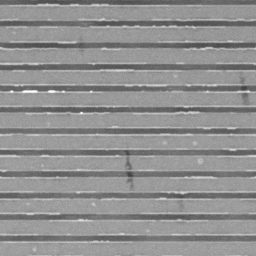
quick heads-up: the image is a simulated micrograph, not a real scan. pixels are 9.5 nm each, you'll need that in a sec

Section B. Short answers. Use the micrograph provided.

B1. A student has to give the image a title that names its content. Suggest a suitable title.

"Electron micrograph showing parallel lines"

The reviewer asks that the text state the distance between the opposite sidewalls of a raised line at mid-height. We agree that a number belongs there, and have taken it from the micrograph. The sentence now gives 14.9 pixels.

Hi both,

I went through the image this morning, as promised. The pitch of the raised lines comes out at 204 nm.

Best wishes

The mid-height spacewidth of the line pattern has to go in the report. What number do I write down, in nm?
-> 61.7